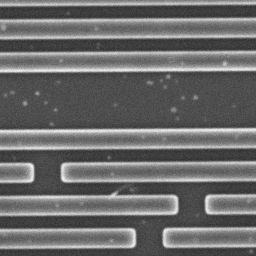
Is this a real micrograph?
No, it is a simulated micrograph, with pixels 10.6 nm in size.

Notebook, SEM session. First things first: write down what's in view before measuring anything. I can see groups of lines, slits or small figures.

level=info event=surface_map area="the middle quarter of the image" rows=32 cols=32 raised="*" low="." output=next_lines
********************************
****************************....
................................
................................
................................
................................
................................
................................
................................
................................
................................
................................
................................
................................
................................
................................
................................
********************************
********************************
********************************
********************************
................................
................................
................................
................................
********************************
********************************
********************************
********************************
................................
................................
................................